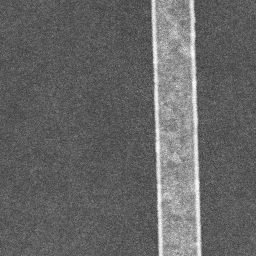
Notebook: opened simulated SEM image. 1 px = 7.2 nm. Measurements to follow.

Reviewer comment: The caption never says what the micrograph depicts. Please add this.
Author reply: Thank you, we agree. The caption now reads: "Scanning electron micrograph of one or a few lines or trenches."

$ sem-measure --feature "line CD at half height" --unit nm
273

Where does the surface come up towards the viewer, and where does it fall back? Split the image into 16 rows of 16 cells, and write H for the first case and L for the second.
LLLLLLLLLLHHLLLL
LLLLLLLLLLHHLLLL
LLLLLLLLLLHHLLLL
LLLLLLLLLLHHLLLL
LLLLLLLLLLHHLLLL
LLLLLLLLLLHHLLLL
LLLLLLLLLLHHLLLL
LLLLLLLLLLHHLLLL
LLLLLLLLLLHHLLLL
LLLLLLLLLLHHLLLL
LLLLLLLLLLHHLLLL
LLLLLLLLLLHHLLLL
LLLLLLLLLLHHLLLL
LLLLLLLLLLHHLLLL
LLLLLLLLLLHHLLLL
LLLLLLLLLLHHLLLL